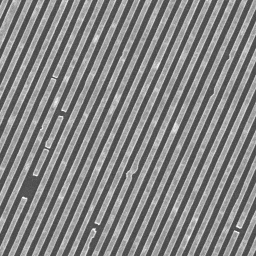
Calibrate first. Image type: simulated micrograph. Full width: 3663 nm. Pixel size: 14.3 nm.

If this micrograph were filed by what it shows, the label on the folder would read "parallel lines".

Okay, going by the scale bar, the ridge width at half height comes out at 71.9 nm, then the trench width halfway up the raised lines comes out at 5.59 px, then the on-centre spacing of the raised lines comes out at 156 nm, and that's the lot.